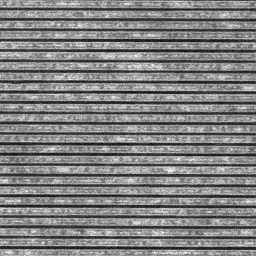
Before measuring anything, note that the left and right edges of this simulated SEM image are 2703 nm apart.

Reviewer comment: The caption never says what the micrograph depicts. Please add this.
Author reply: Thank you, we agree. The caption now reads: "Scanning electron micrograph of parallel lines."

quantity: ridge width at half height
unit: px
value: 6.75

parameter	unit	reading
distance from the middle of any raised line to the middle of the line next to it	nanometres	110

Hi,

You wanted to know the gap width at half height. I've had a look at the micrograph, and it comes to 35.6 nanometres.